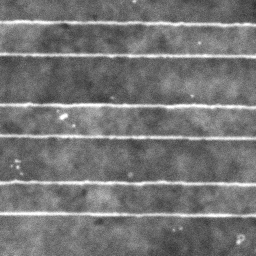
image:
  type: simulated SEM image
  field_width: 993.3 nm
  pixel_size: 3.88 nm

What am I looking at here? lines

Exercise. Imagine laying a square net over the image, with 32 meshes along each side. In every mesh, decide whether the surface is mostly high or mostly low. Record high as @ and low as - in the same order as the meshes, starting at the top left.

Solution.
--------------------------------
--------------------------------
--------------------------------
@@@@@@@@@@@@@@@@@@@@@@@@@@@@@@@@
@@@@@@@@@@@@@@@@@@@@@@@@@@@@@@@@
@@@@@@@@@@@@@@@@@@@@@@@@@@@@@@@@
@@@@@@@@@@@@@@@@@@@@@@@@@@@@@@@@
--------------------------------
--------------------------------
--------------------------------
--------------------------------
--------------------------------
--------------------------------
@@@@@@@@@@@@@@@@@@@@@@@@@@@@@@@@
@@@@@@@@@@@@@@@@@@@@@@@@@@@@@@@@
@@@@@@@@@@@@@@@@@@@@@@@@@@@@@@@@
@@@@@@@@@@@@@@@@@@@@@@@@@@@@@@@@
--------------------------------
--------------------------------
--------------------------------
--------------------------------
--------------------------------
--------------------------------
@@@@@@@@@@@@@@@@@@@@@@@@@@@@@@@@
@@@@@@@@@@@@@@@@@@@@@@@@@@@@@@@@
@@@@@@@@@@@@@@@@@@@@@@@@@@@@@@@@
@@@@@@@@@@@@@@@@@@@@@@@@@@@@@@@@
--------------------------------
--------------------------------
--------------------------------
--------------------------------
--------------------------------